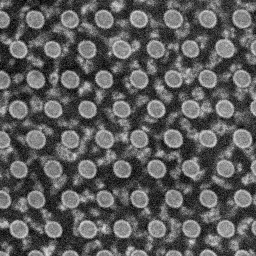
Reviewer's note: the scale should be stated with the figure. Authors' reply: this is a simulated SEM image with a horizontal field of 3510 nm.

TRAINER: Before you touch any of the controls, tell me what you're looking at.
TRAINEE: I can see a regular array of raised bodies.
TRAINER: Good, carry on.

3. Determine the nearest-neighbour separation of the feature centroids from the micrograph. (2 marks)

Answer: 469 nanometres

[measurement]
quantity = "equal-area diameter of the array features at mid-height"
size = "16.6 pixels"